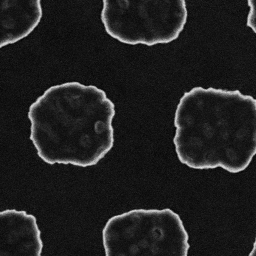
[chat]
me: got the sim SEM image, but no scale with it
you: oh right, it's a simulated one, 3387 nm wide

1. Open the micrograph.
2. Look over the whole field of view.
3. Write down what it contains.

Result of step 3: raised bodies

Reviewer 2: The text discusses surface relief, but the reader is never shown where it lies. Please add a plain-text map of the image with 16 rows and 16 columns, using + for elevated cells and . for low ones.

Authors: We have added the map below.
+++...++++++....
++.....++++.....
+.......+++.....
................
................
...+++..........
..+++++....+++++
..+++++....+++++
..+++++....+++++
..+++++....+++++
..............+.
................
................
++.....++++.....
++.....+++++....
+++....+++++....